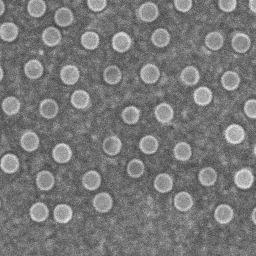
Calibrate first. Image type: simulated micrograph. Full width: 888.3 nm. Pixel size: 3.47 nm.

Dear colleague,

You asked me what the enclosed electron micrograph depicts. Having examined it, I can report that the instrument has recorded a regular array of raised bodies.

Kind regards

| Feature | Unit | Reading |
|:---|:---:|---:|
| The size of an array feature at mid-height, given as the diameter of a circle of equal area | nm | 61.9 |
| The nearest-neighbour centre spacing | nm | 103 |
